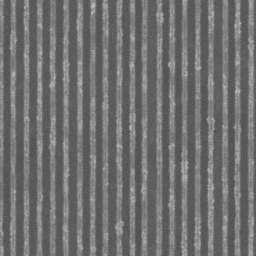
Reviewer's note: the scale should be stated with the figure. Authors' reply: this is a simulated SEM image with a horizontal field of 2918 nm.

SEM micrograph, parallel lines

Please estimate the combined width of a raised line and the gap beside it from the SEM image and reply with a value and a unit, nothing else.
0.151 µm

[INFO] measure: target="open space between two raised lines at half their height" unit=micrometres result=0.0983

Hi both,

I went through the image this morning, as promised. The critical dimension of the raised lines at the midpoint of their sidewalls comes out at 0.0556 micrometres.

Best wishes